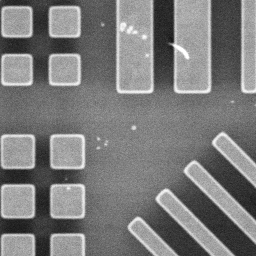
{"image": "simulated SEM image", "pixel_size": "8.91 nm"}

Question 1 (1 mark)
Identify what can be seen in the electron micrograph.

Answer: groups of lines, slits or small figures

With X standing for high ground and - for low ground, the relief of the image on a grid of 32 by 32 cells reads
---------------XXXX---XXXX----XX
XXXX--XXXX-----XXXX---XXXX----XX
XXXX--XXXX-----XXXX---XXXX----XX
XXXX--XXXX-----XXXX---XXXX----XX
-XXX---XXX-----XXXX---XXXX----XX
---------------XXXX---XXXX----XX
---------------XXXX---XXXX----XX
XXXX--XXXX-----XXXX---XXXX----XX
XXXX--XXXX-----XXXX---XXXX----XX
XXXX--XXXX-----XXXX---XXXX----XX
-XXX---XXX-----XXXX---XXXX----XX
--------------------------------
--------------------------------
--------------------------------
--------------------------------
--------------------------------
--------------------------------
XXXX--XXXX-----------------XX---
XXXX--XXXX-----------------XXX--
XXXX--XXXX------------------XXX-
XXXX--XXXX--------------X----XXX
-----------------------XXX----XX
------------------------XXX----X
XXXX--XXXX---------------XXX----
XXXX--XXXX----------XX----XXX---
XXXX--XXXX----------XXX----XXX--
XXXX--XXXX-----------XXX----XXX-
-----------------X----XXX----XXX
----------------XXX----XXX----XX
XXXX---XXX-------XXX----XXX----X
XXXX--XXXX--------XXX----XXX----
XXXX--XXXX---------XXX----XXX---